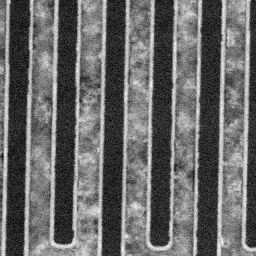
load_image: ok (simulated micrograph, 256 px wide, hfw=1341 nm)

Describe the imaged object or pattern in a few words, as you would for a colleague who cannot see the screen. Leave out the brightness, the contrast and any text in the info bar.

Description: parallel lines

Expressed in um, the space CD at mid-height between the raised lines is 0.128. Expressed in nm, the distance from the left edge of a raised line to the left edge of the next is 252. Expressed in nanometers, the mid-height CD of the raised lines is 124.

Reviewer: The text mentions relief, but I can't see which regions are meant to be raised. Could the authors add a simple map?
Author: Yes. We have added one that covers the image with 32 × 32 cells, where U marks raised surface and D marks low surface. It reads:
DUUUDDDUUUDDDUUUDDDUUUDDDUUUDDDU
DUUUDDDUUUDDDUUUDDDUUUDDDUUUDDDU
DUUUDDDUUUDDDUUUDDDUUUDDDUUUDDDU
DUUUDDDUUUDDDUUUDDDUUUDDDUUUDDDU
DUUUDDDUUUDDDUUUDDDUUUDDDUUUDDDU
DUUUDDDUUUDDDUUUDDDUUUDDDUUUDDDU
DUUUDDDUUUDDDUUUDDDUUUDDDUUUDDDU
DUUUDDDUUUDDDUUUDDDUUUDDDUUUDDDU
DUUUDDDUUUDDDUUUDDDUUUDDDUUUDDDU
DUUUDDDUUUDDDUUUDDDUUUDDDUUUDDDU
DUUUDDDUUUDDDUUUDDDUUUDDDUUUDDDU
DUUUDDDUUUDDDUUUDDDUUUDDDUUUDDDU
DUUUDDDUUUDDDUUUDDDUUUDDDUUUDDDU
DUUUDDDUUUDDDUUUDDDUUUDDDUUUDDDU
DUUUDDDUUUDDDUUUDDDUUUDDDUUUDDDU
DUUUDDDUUUDDDUUUDDDUUUDDDUUUDDDU
DUUUDDDUUUDDDUUUDDDUUUDDDUUUDDDU
DUUUDDDUUUDDDUUUDDDUUUDDDUUUDDDU
DUUUDDDUUUDDDUUUDDDUUUDDDUUUDDDU
DUUUDDDUUUDDDUUUDDDUUUDDDUUUDDDU
DUUDDDDUUDDDDUUDDDDUUDDDDUUUDDDU
DUUDDDDUUDDDDUUDDDDUUDDDDUUUDDDU
DUUDDDDUUDDDDUUDDDDUUDDDDUUUDDDU
DUUDDDDUUDDDDUUDDDDUUDDDUUUUDDDU
DUUDDDDUUDDDDUUDDDDUUDDDUUUUDDDU
DUUDDDDUUDDDDUUDDDDUUDDDDUUDDDDU
DUUDDDDUUDDDDUUDDDDUUDDDDUUDDDDU
DUUDDDDUUDDDDUUDDDDUUDDDUUUDDDDU
UUUDDDUUUDDDUUUDDDUUUDDDUUUDDDUU
UUUDDDUUUDDDUUUDDDDUUDDDUUUDDDUU
UUUDDDDUUDDDUUUDDDDUUDDDUUUDDDUU
UUUDDDDDDDDDUUUDDDDDDDDDUUUDDDDD